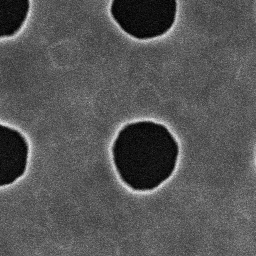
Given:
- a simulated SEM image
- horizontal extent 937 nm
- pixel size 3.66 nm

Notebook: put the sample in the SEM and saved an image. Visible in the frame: holes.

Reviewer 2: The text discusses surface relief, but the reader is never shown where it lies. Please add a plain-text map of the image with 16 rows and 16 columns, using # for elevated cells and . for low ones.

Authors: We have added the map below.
..#####....#####
.######....#####
################
################
################
################
################
################
.######....#####
..#####....#####
..#####....#####
.#######..######
################
################
################
################